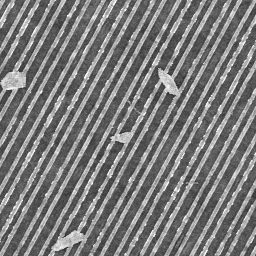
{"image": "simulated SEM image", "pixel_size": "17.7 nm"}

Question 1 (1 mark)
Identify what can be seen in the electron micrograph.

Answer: parallel lines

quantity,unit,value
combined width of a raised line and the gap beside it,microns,0.196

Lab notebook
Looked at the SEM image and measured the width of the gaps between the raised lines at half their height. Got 114 nm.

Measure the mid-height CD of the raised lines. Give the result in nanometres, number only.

56.2